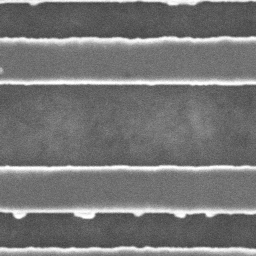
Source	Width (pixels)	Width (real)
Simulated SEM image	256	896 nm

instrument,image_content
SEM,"lines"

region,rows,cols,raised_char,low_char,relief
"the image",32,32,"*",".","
................................
................................
................................
................................
................................
********************************
********************************
********************************
********************************
********************************
........................**.***..
................................
................................
................................
................................
................................
................................
................................
................................
................................
................................
********************************
********************************
********************************
********************************
********************************
********************************
................................
................................
................................
................................
********************************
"